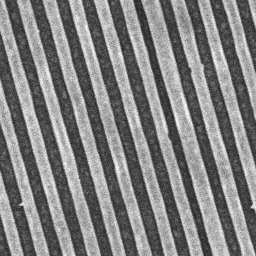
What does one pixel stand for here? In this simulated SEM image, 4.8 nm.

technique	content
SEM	parallel lines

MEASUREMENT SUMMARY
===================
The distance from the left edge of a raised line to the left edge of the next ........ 119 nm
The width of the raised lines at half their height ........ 59.5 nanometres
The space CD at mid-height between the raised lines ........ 12.4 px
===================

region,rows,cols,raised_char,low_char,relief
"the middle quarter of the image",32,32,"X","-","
XX----XXX---XXX----XXX--XXXX---X
XXX---XXX---XXXX---XXX--XXXX----
XXX---XXX----XXX---XXX--XXXXX---
XXX----XXX---XXX----XX---XXXX---
XXXX---XXX---XXX----XXX--XXXX---
-XXX---XXX----XXX---XXX--XXXX---
-XXX---XXXX---XXX---XXX---XXX---
-XXXX---XXX---XXX----XXX--XXXX--
--XXX---XXX---XXX----XXX--XXXX--
--XXX---XXX----XXX---XXX---XXX--
--XXX---XXXX---XXX----XX---XXXX-
--XXXX---XXX---XXX----XXX--XXXX-
---XXX---XXX---XXX----XXX--XXXX-
---XXX---XXXX---XXX---XXX---XXXX
---XXX----XXX---XXX----XX---XXXX
---XXXX---XXX---XXX----XXX--XXXX
----XXX---XXX----XXX---XXX--XXXX
X---XXX---XXXX---XXX---XXX---XXX
X---XXX----XXX---XXX---XXX---XXX
X----XXX---XXX----XXX---XXX--XXX
XX---XXX---XXX----XXX---XXX---XX
XX---XXX----XXX---XXX---XXX---XX
XX----XXX---XXX----XX----XXX--XX
XXX---XXX---XXX----XXX---XXX---X
XXX---XXX---XXXX---XXX---XXX---X
XXX---XXXX---XXX---XXX----XXX--X
XXX---XXXX---XXX---XXXX---XXX--X
-XX----XXX---XXX----XXX---XXX---
-XXX---XXX---XXXX---XXX---XXX---
-XXX---XXX----XXX---XXX----XXX--
-XXX----XXX---XXX---XXXX---XXX--
--XXX---XXX---XXX----XXX---XXX--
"